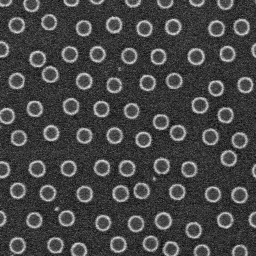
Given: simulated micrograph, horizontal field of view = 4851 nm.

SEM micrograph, a regular array of raised bodies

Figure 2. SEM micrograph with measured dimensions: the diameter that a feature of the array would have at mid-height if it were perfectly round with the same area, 273 nm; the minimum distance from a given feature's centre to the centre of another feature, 0.512 µm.